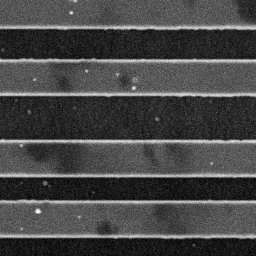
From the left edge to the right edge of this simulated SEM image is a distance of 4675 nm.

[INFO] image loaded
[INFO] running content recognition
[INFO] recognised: lines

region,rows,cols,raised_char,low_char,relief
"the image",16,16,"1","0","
1111111111111111
1111111111111111
0000000000000000
0000000000000000
1111111111111111
1111111111111111
0000000000000000
0000000000000000
0000000000000000
1111111111111111
1111111111111111
0000000000000000
0000000000000000
1111111111111111
1111111111111111
0000000000000000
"